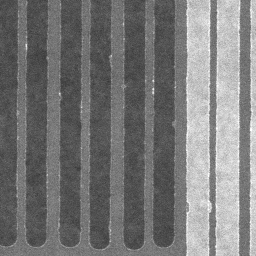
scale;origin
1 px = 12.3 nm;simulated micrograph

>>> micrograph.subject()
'parallel lines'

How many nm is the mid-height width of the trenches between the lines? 137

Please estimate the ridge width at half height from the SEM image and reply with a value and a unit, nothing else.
270 nanometres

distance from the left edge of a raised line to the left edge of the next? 391 nm